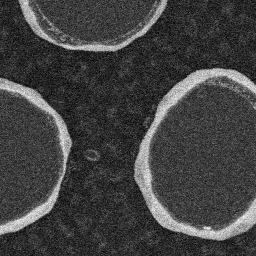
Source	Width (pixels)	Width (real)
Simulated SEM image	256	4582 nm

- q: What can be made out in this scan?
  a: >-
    raised bodies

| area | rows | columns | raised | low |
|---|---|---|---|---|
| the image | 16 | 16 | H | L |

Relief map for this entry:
LLHHHHHHHHLLLLLL
LLHHHHHHHLLLLLLL
LLLHHHHHLLLLLLLL
LLLLLLLLLLLLLLLL
LLLLLLLLLLLLLLLL
HLLLLLLLLLLHHHHH
HHHLLLLLLLHHHHHH
HHHHLLLLLLHHHHHH
HHHHLLLLLHHHHHHH
HHHHLLLLLHHHHHHH
HHHHLLLLLHHHHHHH
HHHHLLLLLHHHHHHH
HHHLLLLLLLHHHHHH
HHLLLLLLLLHHHHHH
LLLLLLLLLLLLHHLL
LLLLLLLLLLLLLLLL